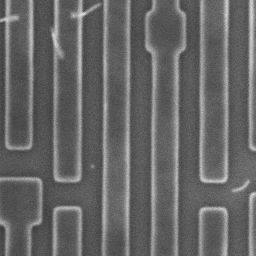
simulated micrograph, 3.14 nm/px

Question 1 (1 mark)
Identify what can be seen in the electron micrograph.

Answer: wiring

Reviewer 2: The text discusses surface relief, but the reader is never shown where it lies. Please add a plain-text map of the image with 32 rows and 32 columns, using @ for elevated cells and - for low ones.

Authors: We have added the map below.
-@@@---@@@---@@@---@@@---@@@---@
-@@@---@@@---@@@---@@@@--@@@---@
-@@@---@@@---@@@--@@@@@--@@@---@
-@@@---@@@---@@@--@@@@@--@@@---@
-@@@---@@@---@@@--@@@@@--@@@---@
-@@@---@@@---@@@--@@@@@--@@@---@
-@@@---@@@---@@@---@@@@--@@@---@
-@@@---@@@---@@@---@@@---@@@---@
-@@@---@@@---@@@---@@@---@@@---@
-@@@---@@@---@@@---@@@---@@@---@
-@@@---@@@---@@@---@@@---@@@---@
-@@@---@@@---@@@---@@@---@@@---@
-@@@---@@@---@@@---@@@---@@@---@
-@@@---@@@---@@@---@@@---@@@---@
-@@@---@@@---@@@---@@@---@@@---@
-@@@---@@@---@@@---@@@---@@@---@
-@@@---@@@---@@@---@@@---@@@---@
-@@@---@@@---@@@---@@@---@@@---@
-@@----@@@---@@@---@@@---@@@---@
-------@@@---@@@---@@@---@@@----
-------@@@---@@@---@@@---@@@----
-------@@@---@@@---@@@---@@@----
@@@@@--@@@---@@@---@@@---@@@----
@@@@@--------@@@---@@@----------
@@@@@--------@@@---@@@---------@
@@@@@--------@@@---@@@---------@
@@@@@--@@@---@@@---@@@---@@@---@
@@@@@--@@@---@@@---@@@---@@@---@
-@@@---@@@---@@@---@@@---@@@---@
-@@@---@@@---@@@---@@@---@@@---@
-@@@---@@@---@@@---@@@---@@@---@
-@@@---@@@---@@@---@@@---@@@---@